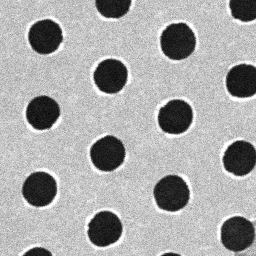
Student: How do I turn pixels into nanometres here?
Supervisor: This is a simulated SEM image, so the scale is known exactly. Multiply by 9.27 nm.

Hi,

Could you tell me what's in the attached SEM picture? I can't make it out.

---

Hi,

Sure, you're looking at a regular array of holes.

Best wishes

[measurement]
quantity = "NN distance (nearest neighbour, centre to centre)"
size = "0.701 micrometres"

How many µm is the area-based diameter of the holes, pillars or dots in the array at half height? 0.334